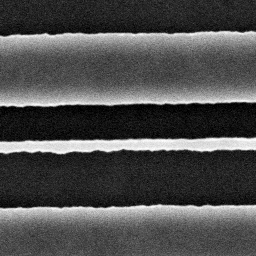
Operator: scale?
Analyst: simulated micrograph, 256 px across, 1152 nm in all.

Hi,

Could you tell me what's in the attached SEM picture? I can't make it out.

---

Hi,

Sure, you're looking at lines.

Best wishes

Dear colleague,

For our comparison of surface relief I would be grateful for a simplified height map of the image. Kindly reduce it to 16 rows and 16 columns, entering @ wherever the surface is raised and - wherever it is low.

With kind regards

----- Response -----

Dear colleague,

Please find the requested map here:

----------------
----------------
@@@@@@@@@@@@@@@@
@@@@@@@@@@@@@@@@
@@@@@@@@@@@@@@@@
@@@@@@@@@@@@@@@@
@@@@@@@@--------
----------------
----------------
@--@------------
----------------
----------------
----------------
@@@@@@@@@@@@@@@@
@@@@@@@@@@@@@@@@
@@@@@@@@@@@@@@@@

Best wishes